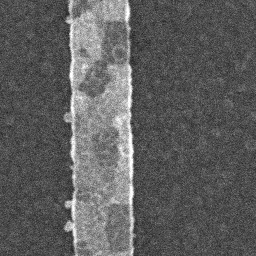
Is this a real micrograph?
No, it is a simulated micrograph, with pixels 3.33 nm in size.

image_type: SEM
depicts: one or a few lines or trenches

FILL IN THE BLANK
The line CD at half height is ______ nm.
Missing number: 193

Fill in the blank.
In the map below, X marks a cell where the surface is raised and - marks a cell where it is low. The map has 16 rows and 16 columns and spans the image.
----XXXX--------
----XXXX--------
----XXXX--------
-----XXX--------
----XXXX--------
----XXXX--------
----XXXX--------
-----XXX--------
-----XXX--------
-----XXX--------
-----XXX--------
-----XXX--------
-----XXX--------
-----XXX--------
-----XXX--------
-----XXX--------